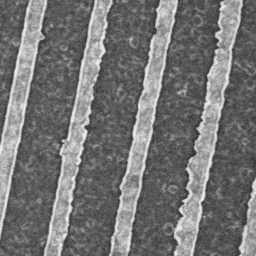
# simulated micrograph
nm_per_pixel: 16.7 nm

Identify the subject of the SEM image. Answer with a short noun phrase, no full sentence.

one or a few lines or trenches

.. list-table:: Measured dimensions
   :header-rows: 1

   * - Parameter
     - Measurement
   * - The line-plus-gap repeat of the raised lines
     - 1.07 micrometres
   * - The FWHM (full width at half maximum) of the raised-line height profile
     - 258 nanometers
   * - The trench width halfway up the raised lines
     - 823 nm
